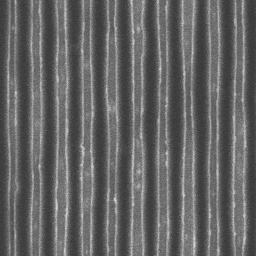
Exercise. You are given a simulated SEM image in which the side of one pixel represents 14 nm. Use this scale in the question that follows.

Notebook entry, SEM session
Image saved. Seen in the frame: parallel lines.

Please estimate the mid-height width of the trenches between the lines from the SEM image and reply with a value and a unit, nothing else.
7.37 pixels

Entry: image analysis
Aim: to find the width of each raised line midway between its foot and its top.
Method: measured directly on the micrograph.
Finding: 245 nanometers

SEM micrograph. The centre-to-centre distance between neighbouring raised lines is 354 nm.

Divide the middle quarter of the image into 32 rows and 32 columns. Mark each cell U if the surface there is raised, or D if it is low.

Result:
DUUUUDDUUUUDDUUUUDDDUUUUDDUUUUDD
DUUUUDDUUUUDDUUUUDDDUUUUDDUUUUDD
DUUUUDDUUUUDDUUUUDDDUUUUDDUUUUDD
DUUUUDDUUUUDDUUUUDDDUUUUDDUUUUDD
DUUUUDDUUUUDDUUUUDDDUUUUDDUUUUDD
DUUUUDDUUUUDDUUUUDDDUUUUDDUUUUDD
DUUUUDDUUUUDDUUUUDDDUUUUDDUUUUDD
DUUUUDDUUUUDDUUUUDDDUUUUDDUUUUDD
DUUUUDDUUUUDDUUUUDDDUUUUDDUUUUDD
DUUUUDDUUUUDDUUUUDDDUUUUDDUUUUDD
DUUUUDDUUUUDDUUUUDDDUUUUDUUUUUDD
DUUUUDDUUUUDDUUUUDDUUUUUDDUUUUDD
DUUUUDDUUUUDDUUUUDDUUUUUDUUUUUDD
DUUUUDDUUUUDDUUUUDDUUUUUDDUUUUDD
DUUUUDDUUUUDDUUUUDDUUUUUDDUUUUDD
DUUUUDDUUUUDDUUUUDDUUUUUDDUUUUDD
DUUUUDDUUUUDDUUUUDDUUUUUDDUUUUDD
DUUUUDDUUUUDDUUUUDDUUUUUDDUUUUDD
DUUUUDDUUUUDDUUUUDDUUUUUDDUUUUDD
DUUUUDDUUUUDDUUUUDDDUUUUDDUUUUDD
DUUUUDDUUUUDDUUUUDDDUUUUDDUUUUDD
UUUUUDDUUUUDDUUUUDDDUUUUDDUUUUDD
UUUUUDDUUUUDDUUUUDDDUUUUDDUUUUDD
DUUUUDDUUUUDDUUUUDDDUUUUDDUUUUDD
DUUUUDDUUUUDDUUUUDDDUUUUDDUUUUDD
DUUUDDDUUUUDDUUUUDDDUUUUDDUUUUDD
DUUUDDDUUUUDDUUUUDDDUUUUDDUUUUDD
DUUUDDDUUUUDDUUUUDDDUUUUDDUUUUDD
DUUUDDDUUUUDDUUUUDDDUUUUDDUUUUDD
DUUUDDDUUUUDDUUUUDDDUUUUDDUUUUDD
DUUUDDDUUUUDDUUUUDDDUUUUDDUUUUDD
DUUUDDDUUUUDDUUUUDDDUUUUDDUUUUDD